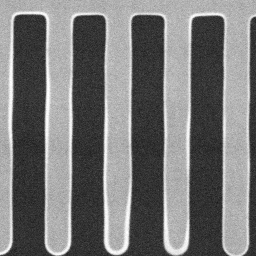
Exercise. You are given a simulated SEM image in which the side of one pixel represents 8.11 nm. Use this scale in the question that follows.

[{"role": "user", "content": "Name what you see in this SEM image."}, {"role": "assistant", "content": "groups of lines, slits or small figures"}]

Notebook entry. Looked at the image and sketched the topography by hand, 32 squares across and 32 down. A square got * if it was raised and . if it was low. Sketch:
********************************
********************************
**....***....***.....***....***.
**....***....***.....***....***.
**....***....***.....***....***.
**....***....***.....***....***.
*.....***....***.....***....***.
*.....***....***.....***....***.
*.....***....***.....***....***.
*.....***....***.....***....***.
*.....***....***.....***....***.
*.....***....***.....***....***.
*.....***....***.....***....***.
*.....***....***.....***....***.
*.....***....***.....***....***.
*.....***....***.....***....***.
*.....***....***.....***....***.
*.....***....***.....***....***.
*.....***....***.....***....***.
*.....***....***.....***....***.
*.....***....***.....***....***.
*.....***....***.....***....***.
*.....***....***.....***....***.
*.....***....***.....***....***.
*.....***....***.....***....***.
*.....***....***.....***....***.
*.....***....***.....***....***.
*.....***....***.....***....***.
*.....***....***.....***....***.
*.....***....***.....**.....***.
*.....***....***.....**.....***.
*.....**......*.............***.